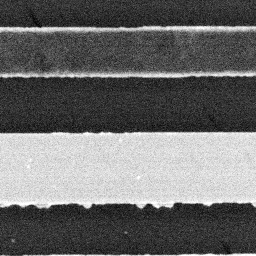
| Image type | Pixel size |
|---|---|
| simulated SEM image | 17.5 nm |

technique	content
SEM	lines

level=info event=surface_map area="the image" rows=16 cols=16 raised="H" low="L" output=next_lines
LLLLLLLLLLLLLLLL
LLLLLLLLLLLLLLLL
HHHHHHHHHHHHHHHH
HHHHHHHHHHHHHHHH
HHHHHHHHHHHHHHHH
LLLLLLLLLLLLLLLL
LLLLLLLLLLLLLLLL
LLLLLLLLLLLLLLLL
HHHHHHHHHHHHHHHH
HHHHHHHHHHHHHHHH
HHHHHHHHHHHHHHHH
HHHHHHHHHHHHHHHH
HHHHHHHHHHHHHHHH
LLLLLLLLLLLLLLLL
LLLLLLLLLLLLLLLL
LLLLLLLLLLLLLLLL